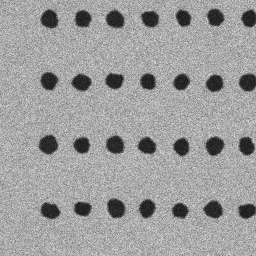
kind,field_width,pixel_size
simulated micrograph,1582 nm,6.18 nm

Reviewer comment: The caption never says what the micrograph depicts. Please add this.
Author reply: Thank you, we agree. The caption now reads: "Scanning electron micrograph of a regular array of holes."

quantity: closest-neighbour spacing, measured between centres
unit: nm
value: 202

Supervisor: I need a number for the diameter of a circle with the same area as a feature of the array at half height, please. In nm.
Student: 108